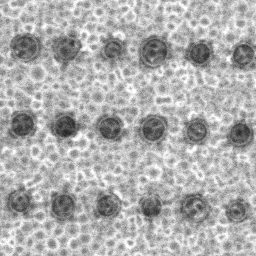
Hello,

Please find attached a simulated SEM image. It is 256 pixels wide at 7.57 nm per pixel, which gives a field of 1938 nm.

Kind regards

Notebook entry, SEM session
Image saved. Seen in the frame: a regular array of raised bodies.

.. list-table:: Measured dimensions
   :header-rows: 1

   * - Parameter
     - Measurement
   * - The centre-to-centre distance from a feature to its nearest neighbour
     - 327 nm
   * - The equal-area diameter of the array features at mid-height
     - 0.174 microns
